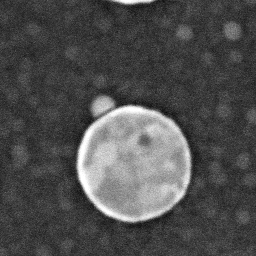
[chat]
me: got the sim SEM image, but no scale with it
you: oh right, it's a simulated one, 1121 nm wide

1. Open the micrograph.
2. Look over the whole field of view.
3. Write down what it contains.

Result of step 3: raised bodies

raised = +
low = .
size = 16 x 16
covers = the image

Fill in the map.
................
................
................
................
................
................
......+.........
......+++++.....
.....++++++.....
.....+++++++....
.....+++++++....
.....+++++++....
......+++++.....
.......+++......
................
................